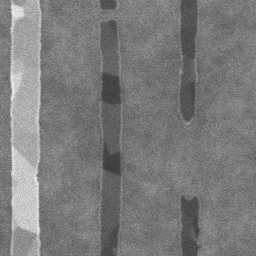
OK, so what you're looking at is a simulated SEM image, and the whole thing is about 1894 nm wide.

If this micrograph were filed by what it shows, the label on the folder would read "one or a few lines or trenches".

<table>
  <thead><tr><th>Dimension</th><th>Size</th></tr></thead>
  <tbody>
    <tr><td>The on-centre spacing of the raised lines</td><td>613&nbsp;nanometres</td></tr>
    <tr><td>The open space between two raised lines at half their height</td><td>450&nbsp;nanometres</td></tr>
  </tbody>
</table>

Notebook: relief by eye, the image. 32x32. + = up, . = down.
..+++.......+++.......+++.......
..+++.................+++.......
..+++........+........+++.......
.++++.......+++.......+++.......
.++++.......+++.......+++.......
..+++.......+++.......+++.......
.++++.......+++........+........
.++++........++........+........
.++++........++........++.......
.++++........++.......+++.......
.++++........++.......+++.......
..+++........++.......+++.......
..+++........++.......+++.......
.++++........++.......++........
.++++........++........+........
.++++........++.................
..+++........++.................
.++++........++.................
..+++........++.................
..+++........++.................
..+++........++.................
..+++........++.................
..+++........++.................
..+++........++.................
..+++........++.................
..+++........++.......+++.......
..+++.......+++........++.......
..+++.......+++........++.......
..+++.......+++........++.......
..+++.......+++.......+++.......
.++++.......+++.......+++.......
.++++.......+++........++.......